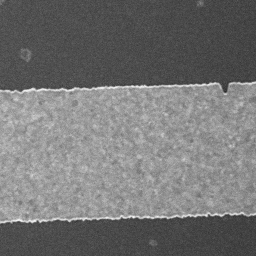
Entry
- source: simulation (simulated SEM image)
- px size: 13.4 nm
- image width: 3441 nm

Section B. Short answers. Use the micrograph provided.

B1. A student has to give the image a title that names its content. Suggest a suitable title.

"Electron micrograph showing one or a few lines or trenches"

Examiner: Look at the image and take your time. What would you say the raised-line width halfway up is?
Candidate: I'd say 1760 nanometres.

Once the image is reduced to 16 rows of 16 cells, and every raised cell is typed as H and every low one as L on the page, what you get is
LLLLLLLLLLLLLLLL
LLLLLLLLLLLLLLLL
LLLLLLLLLLLLLLLL
LLLLLLLLLLLLLLLL
LLLLLLLLLLLLLLLL
LLLLLLHHHHHHHHHH
HHHHHHHHHHHHHHHH
HHHHHHHHHHHHHHHH
HHHHHHHHHHHHHHHH
HHHHHHHHHHHHHHHH
HHHHHHHHHHHHHHHH
HHHHHHHHHHHHHHHH
HHHHHHHHHHHHHHHH
HHHHHHHHHHHLLLLL
LLLLLLLLLLLLLLLL
LLLLLLLLLLLLLLLL